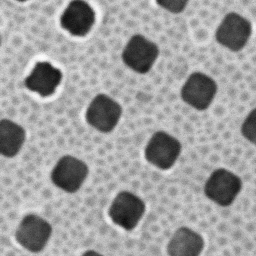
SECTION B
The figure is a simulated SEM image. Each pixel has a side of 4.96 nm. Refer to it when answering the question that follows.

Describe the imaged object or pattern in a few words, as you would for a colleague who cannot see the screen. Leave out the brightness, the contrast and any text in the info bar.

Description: a regular array of holes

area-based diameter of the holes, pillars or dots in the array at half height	37.4	pixels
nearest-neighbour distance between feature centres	343	nanometres